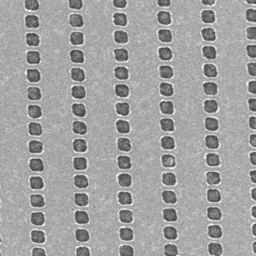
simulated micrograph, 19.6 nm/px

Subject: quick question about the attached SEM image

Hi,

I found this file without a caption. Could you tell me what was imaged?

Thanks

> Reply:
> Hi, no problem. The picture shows a regular array of holes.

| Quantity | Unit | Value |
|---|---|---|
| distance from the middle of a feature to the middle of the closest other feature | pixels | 17.8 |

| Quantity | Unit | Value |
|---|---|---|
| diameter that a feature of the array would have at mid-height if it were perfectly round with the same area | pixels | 14.8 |